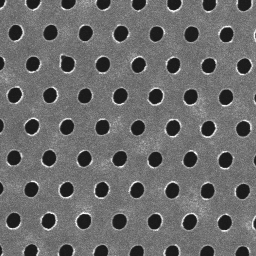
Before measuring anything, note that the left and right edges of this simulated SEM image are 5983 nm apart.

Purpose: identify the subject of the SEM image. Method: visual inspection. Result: a regular array of holes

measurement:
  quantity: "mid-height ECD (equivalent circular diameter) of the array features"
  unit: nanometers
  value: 354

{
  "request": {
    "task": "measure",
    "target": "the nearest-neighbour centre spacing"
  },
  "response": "35 pixels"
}